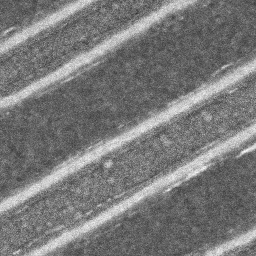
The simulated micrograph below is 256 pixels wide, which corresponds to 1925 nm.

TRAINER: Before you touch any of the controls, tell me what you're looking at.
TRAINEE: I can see one or a few lines or trenches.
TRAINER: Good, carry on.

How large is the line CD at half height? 664 nm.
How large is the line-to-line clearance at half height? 433 nanometers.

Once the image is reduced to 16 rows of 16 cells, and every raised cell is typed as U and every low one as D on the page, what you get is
UUUUDDDDDDDUUUUU
UUUDDDDDDUUUUUUU
UDDDDDDUUUUUUUUU
DDDDDDUUUUUUUUUU
DDDDUUUUUUUUUUUD
DDUUUUUUUUUUUDDD
UUUUUUUUUUUUDDDD
UUUUUUUUUUDDDDDD
UUUUUUUUDDDDDDDU
UUUUUUDDDDDDDDUU
UUUUDDDDDDDDUUUU
UUUDDDDDDDUUUUUU
UDDDDDDDUUUUUUUU
DDDDDDDUUUUUUUUU
DDDDDUUUUUUUUUUU
DDDUUUUUUUUUUUDD